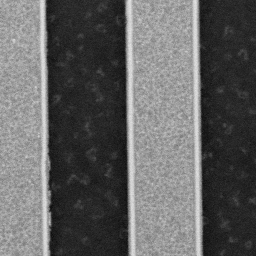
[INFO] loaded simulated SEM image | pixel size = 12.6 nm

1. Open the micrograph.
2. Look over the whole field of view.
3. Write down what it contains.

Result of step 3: one or a few lines or trenches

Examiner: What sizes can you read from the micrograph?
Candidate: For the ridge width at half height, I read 817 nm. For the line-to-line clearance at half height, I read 1100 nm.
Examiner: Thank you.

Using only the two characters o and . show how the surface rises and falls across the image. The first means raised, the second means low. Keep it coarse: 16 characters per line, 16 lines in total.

ooo.....oooo....
ooo.....oooo....
ooo.....oooo....
ooo.....oooo....
ooo.....oooo....
ooo.....oooo....
ooo.....oooo....
ooo.....oooo....
ooo.....oooo....
ooo.....oooo....
ooo.....oooo....
ooo.....oooo....
ooo.....oooo....
ooo.....oooo....
ooo.....oooo....
ooo.....oooo....